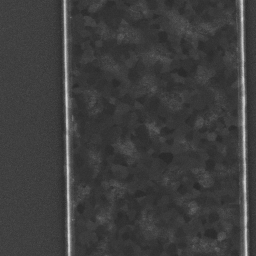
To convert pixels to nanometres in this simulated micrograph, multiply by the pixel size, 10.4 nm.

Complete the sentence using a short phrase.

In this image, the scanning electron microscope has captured one or a few lines or trenches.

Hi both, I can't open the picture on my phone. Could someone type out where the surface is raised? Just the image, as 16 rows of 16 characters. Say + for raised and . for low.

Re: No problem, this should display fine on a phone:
....+++++++++++.
....+++++++++++.
....+++++++++++.
....+++++++++++.
....+++++++++++.
....+++++++++++.
....+++++++++++.
....+++++++++++.
....+++++++++++.
....+++++++++++.
....+++++++++++.
....+++++++++++.
....+++++++++++.
....+++++++++++.
....+++++++++++.
....+++++++++++.